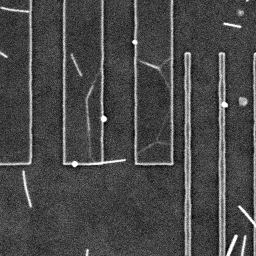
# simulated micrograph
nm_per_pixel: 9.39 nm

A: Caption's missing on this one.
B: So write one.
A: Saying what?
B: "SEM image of wiring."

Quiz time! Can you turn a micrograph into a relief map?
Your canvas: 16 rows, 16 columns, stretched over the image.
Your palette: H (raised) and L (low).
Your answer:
HHLLHHLLHHHLLLLL
HHLLHHLLHHHLLLLL
HHLLHHLLHHHLLLLL
HHLLHHLLHHHLLLLL
HHLLHHLLHHHLLLLL
HHLLHHLLHHHLLLLL
HHLLHHLLHHHLLLLL
HHLLHHLLHHHLLLLL
HHLLHHLLHHHLLLLL
HHLLHHLLHHHLLLLL
LLLLLLLLLLLLLLLL
LLLLLLLLLLLLLLLL
LLLLLLLLLLLLLLLL
LLLLLLLLLLLLLLLL
LLLLLLLLLLLLLLLL
LLLLLLLLLLLLLLLL